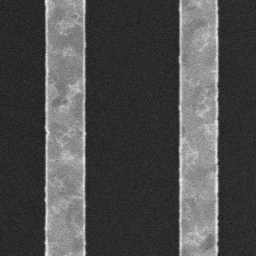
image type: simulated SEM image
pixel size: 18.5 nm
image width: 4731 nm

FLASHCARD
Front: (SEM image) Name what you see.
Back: one or a few lines or trenches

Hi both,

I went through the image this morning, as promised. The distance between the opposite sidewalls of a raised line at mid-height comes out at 693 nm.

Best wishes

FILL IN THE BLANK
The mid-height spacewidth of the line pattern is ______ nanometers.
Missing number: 1770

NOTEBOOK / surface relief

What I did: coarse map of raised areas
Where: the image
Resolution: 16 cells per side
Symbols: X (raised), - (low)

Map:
---XX------XXX--
---XX------XXX--
---XX------XXX--
---XX------XXX--
---XX------XXX--
---XX------XXX--
---XX------XXX--
---XX------XXX--
---XX------XXX--
---XX------XXX--
---XX------XXX--
---XX------XXX--
---XX------XXX--
---XX------XXX--
---XX------XXX--
---XX------XXX--